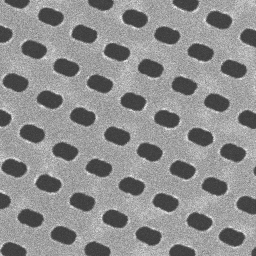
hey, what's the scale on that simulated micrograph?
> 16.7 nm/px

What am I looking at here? a regular array of holes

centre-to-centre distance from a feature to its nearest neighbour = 613 nanometres